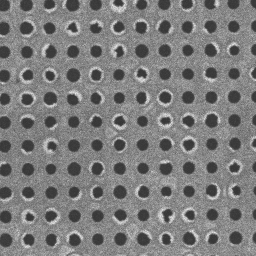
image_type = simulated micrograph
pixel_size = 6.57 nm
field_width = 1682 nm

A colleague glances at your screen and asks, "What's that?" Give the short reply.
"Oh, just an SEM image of a regular array of holes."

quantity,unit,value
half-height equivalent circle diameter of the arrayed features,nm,77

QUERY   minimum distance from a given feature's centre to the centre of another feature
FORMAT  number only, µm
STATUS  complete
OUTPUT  0.15